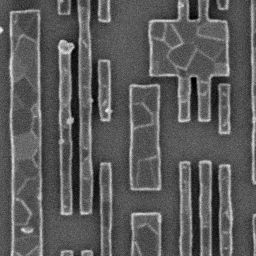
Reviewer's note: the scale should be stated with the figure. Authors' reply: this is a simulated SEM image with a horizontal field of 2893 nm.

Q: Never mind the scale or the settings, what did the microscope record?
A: wiring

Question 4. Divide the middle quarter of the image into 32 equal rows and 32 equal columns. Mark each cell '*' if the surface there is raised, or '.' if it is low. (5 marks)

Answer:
**..***..**...........**********
**..***..**...........**********
**..***..**...........**********
**..***..**..................***
**..***..**..................**.
**..***..**......*******.....**.
**..***..**......*******.....**.
**..***..**......*******.....**.
**..***..**......*******.....**.
**..***..**......*******.....**.
**..***..**......*******.....**.
**..***..***.....*******.....**.
**..***..***.....*******.....**.
**..***..**......*******.....**.
**..**...........*******........
**..**...........*******........
**..**...........*******........
**..***..........*******........
**..***..........*******........
**..***..........*******........
**..***..........*******........
**..***..........*******........
**..***..........*******........
**..***..........*******........
**..***..........*******........
**..***..***.....*******.....**.
**..***..***.....*******.....**.
**..***..***.....*******.....**.
**..***..***.....*******.....**.
**..***..***.....*******.....**.
**..***..***.....*******.....**.
**..***..***.................**.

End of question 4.